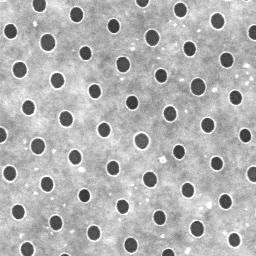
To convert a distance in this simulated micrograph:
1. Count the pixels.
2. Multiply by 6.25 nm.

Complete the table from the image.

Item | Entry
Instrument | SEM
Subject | a regular array of holes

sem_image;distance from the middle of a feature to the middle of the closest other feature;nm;243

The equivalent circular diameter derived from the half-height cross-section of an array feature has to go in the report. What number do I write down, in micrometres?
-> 0.09